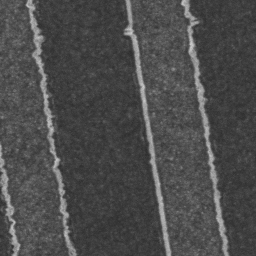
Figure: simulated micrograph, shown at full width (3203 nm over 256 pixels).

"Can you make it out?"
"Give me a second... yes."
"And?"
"one or a few lines or trenches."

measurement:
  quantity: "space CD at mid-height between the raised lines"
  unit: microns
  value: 1.2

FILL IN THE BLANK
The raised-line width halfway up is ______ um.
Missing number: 0.724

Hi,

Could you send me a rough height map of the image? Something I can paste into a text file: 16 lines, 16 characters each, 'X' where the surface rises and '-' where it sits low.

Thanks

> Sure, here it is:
XX------XXXX----
XX------XXXX----
XX------XXXX----
XX-------XXX----
XXX------XXX----
XXX------XXX----
XXX------XXXX---
XXX------XXXX---
XXX------XXXX---
XXX------XXXX---
XXXX------XXX---
XXXX------XXX---
XXXX------XXXX--
-XXX------XXXX--
-XXX------XXXX--
-XXX------XXXX--